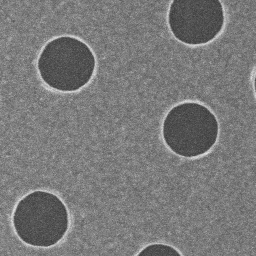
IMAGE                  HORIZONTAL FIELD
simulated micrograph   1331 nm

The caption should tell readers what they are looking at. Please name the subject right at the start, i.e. holes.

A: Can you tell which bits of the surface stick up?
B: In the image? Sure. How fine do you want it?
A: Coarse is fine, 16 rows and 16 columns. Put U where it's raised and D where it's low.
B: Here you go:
UUUUUUUUUUUDDDUU
UUUUUUUUUUUDDDUU
UUUDDUUUUUUDDUUU
UUDDDDUUUUUUUUUU
UUDDDDUUUUUUUUUU
UUUDDUUUUUUUUUUU
UUUUUUUUUUUDUUUU
UUUUUUUUUUDDDDUU
UUUUUUUUUUDDDDUU
UUUUUUUUUUUDDUUU
UUUUUUUUUUUUUUUU
UUUUUUUUUUUUUUUU
UDDDUUUUUUUUUUUU
UDDDUUUUUUUUUUUU
UDDDUUUUUUUUUUUU
UUUUUUUUUDDUUUUU